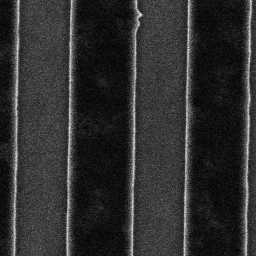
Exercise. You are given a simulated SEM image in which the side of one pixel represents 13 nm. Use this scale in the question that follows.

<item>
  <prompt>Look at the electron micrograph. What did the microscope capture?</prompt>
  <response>one or a few lines or trenches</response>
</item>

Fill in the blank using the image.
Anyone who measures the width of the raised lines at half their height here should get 830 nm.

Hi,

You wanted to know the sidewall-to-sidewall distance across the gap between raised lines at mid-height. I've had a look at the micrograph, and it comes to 670 nanometres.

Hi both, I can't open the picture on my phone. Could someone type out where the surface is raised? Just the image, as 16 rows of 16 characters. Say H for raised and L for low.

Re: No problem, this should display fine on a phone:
HLLLHHHHHLLLHHHH
HLLLHHHHHLLLHHHH
HLLLHHHHLLLLHHHH
HLLLHHHHLLLLHHHH
HLLLHHHHLLLLHHHH
HLLLHHHHLLLLHHHH
HLLLHHHHLLLLHHHH
HLLLHHHHLLLLHHHH
HLLLHHHHLLLLHHHH
HLLLHHHHLLLLHHHL
HLLLHHHHLLLLHHHL
HLLLHHHHLLLLHHHL
HLLLHHHHLLLLHHHL
HLLLHHHHLLLLHHHL
HLLLHHHHLLLLHHHL
HLLLHHHHLLLLHHHL